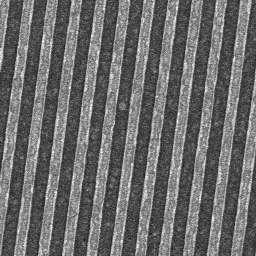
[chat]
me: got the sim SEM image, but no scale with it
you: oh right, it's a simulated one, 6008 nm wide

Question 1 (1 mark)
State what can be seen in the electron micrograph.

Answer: parallel lines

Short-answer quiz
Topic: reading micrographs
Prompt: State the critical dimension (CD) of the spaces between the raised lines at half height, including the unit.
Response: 14.1 pixels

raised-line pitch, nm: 561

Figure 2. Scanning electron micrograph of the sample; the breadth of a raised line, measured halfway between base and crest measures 221 nm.